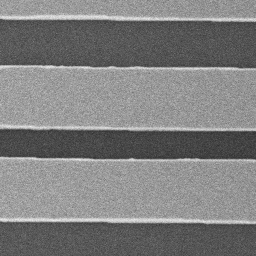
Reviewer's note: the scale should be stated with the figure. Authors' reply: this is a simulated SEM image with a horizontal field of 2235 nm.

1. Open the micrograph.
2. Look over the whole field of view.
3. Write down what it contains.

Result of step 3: lines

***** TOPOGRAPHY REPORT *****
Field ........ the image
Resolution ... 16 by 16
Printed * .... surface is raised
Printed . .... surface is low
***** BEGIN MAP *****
****************
................
................
................
****************
****************
****************
****************
................
................
****************
****************
****************
****************
................
................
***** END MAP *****